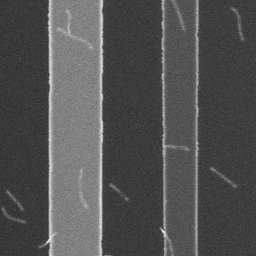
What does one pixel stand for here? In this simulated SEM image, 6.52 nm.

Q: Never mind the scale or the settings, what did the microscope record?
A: lines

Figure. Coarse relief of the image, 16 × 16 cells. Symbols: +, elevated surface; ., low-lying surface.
...+++....++....
...+++....++....
...+++....++....
...+++....++....
...+++....++....
...+++....++....
...+++....++....
...+++....++....
...+++....++....
...+++....++....
...+++....++....
...+++....++....
...+++....++....
...+++....++....
...+++....++....
...+++....++....